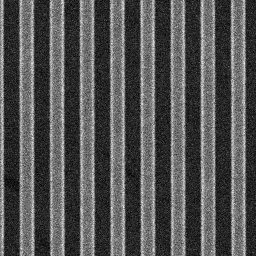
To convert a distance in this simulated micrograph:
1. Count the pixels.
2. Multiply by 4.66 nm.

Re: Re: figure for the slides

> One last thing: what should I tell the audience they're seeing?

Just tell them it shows parallel lines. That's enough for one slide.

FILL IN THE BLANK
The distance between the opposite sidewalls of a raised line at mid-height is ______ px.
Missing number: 13.4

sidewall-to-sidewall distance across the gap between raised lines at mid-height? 78.6 nm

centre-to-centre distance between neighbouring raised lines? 0.141 µm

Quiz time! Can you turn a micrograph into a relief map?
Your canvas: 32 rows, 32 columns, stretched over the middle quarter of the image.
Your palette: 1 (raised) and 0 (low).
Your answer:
00001110000011100001111000011100
00001110000011100001111000011100
00001110000011100001111000011100
00001110000011100001111000011100
00001110000011100001111000011100
00001110000011100001111000011100
00001110000011100001111000011100
00001110000011100001111000011100
00001110000011100001111000011100
00001110000011100001110000011100
00001110000011100001110000011100
00001110000011100001110000011100
00001110000011100001110000011100
00001110000011100001110000011100
00001110000011100001110000011100
00001110000011100001111000011100
00001110000011100001111000011100
00001110000011100001111000011100
00001110000011100001111000011100
00001110000011100001111000011100
00001110000011100001111000011100
00001110000011100001111000011100
00001110000011100001111000011100
00001110000011100001111000011100
00001110000011100001111000011100
00001110000011100001111000011100
00001110000011100001111000011100
00001110000011100001111000011100
00001110000011100001111000011100
00001110000011100001111000011100
00001110000011100001111000011100
00001110000011100001111000011100